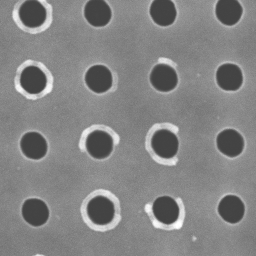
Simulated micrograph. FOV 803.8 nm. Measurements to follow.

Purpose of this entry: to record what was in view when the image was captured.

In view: a regular array of holes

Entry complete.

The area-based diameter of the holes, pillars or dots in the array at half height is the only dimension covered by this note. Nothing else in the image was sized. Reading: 85.8 nm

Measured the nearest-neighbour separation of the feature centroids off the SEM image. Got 0.205 micrometres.